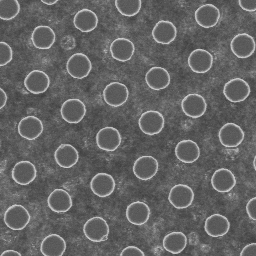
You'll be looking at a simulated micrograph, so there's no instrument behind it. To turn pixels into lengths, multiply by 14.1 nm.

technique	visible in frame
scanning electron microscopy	a regular array of raised bodies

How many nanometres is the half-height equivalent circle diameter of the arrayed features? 328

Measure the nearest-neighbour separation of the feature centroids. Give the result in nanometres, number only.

634